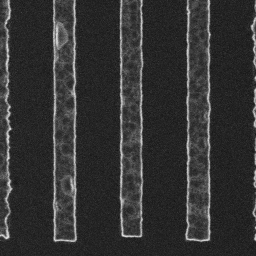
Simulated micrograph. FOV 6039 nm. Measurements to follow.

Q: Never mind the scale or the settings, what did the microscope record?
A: one or a few lines or trenches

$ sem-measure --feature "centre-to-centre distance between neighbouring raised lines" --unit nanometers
1580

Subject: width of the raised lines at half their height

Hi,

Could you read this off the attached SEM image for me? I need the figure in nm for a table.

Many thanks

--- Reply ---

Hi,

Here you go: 490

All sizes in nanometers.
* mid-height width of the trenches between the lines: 1090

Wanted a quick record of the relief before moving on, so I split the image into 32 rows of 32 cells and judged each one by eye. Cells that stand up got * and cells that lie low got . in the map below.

*......**......***.....***......
*......**......***......**......
*......**......***......**......
*......**......***......**......
*......**......***.....***......
*......**......***.....***......
*......**......***.....***......
*......**......***.....***......
*......**......***......**......
*......**......***.....***......
*......**......***......**......
*......**......***......**......
*......**......***.....***......
*......**......***.....***......
*......**......***.....***......
*......**......***......**......
*......**......***.....***......
*......**......***.....***......
*......**......***.....***......
*......**......***......**......
*......**......***.....***......
*......**......***.....***......
*......**......***......**......
*......**......***.....***......
*......**......***.....***......
*......**......***.....***......
*......**......***.....***......
*......**......***.....***......
*......**......***.....***......
*......**..............***......
................................
................................